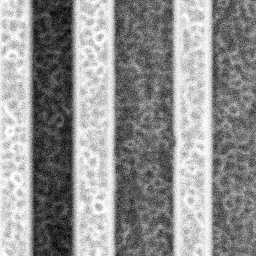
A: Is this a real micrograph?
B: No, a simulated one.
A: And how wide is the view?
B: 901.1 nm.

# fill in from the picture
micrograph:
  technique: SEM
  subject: one or a few lines or trenches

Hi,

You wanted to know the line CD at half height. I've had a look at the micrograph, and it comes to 121 nanometres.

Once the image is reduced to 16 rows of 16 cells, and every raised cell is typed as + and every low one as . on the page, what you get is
++...++....++...
++...++....++...
++...++....++...
++...++....++...
++...++....++...
++...++....++...
++...++....++...
++...++....++...
++...++....++...
++...++....++...
++...++....++...
++...++....++...
++...++....++...
++...++....++...
++...++....++...
++...++....++...